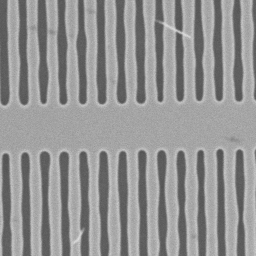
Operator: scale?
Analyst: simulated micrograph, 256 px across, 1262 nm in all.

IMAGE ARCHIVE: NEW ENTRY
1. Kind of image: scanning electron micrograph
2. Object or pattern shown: groups of lines, slits or small figures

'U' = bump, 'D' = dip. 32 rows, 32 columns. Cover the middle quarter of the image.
DUUDDDUUDDDUUDDUUUDDUUUDDUUUDDUU
DUUDDDUUDDDUUDDUUUDDUUUDDUUUDDUU
DUUUDDUUDDDUUDDUUUDDUUUDDUUUDDUU
DUUUDDUUDDDUUDDUUUDDDUUDDUUUDDUU
DUUUDDUUDDDUUDDDUUDDDUUDDUUUDDUU
DUUUDDUUDDDUUDDDUUDDUUUDDUUUDDUU
DUUUDDUUDDDUUDDDUUDDDUUDDUUUDDUU
DUUUDDUUDDDUUDDDUUDDDUUDDUUUDDUU
DUUUDDUUDDDUUDDDUUDDDUUDDUUUDDUU
DUUUDDUUUDDUUUDUUUDDUUUUUUUUUUUU
UUUUUUUUUUUUUUUUUUUUUUUUUUUUUUUU
UUUUUUUUUUUUUUUUUUUUUUUUUUUUUUUU
UUUUUUUUUUUUUUUUUUUUUUUUUUUUUUUU
UUUUUUUUUUUUUUUUUUUUUUUUUUUUUUUU
UUUUUUUUUUUUUUUUUUUUUUUUUUUUUUUU
UUUUUUUUUUUUUUUUUUUUUUUUUUUUUUUU
UUUUUUUUUUUUUUUUUUUUUUUUUUUUUUUU
UUUUUUUUUUUUUUUUUUUUUUUUUUUUUUUU
UUUUUUUUUUUUUUUUUUUUUUUUUUUUUUUU
UUUUUUUUUUUUUUUUUUUUUUUUUUUUUUUU
UUUUUUUUUUUUUUUUUUUUUUUUUUUUUUUU
UUUUUUUUUUUUUUUUUUUDUUUUUUUUUUUU
DUUUDDUUUDDUUUDDUUDDDUUDDUUUDDUU
DUUUDDUUUDDUUUDDUUDDDUUDDDUUDDUU
DUUUDDUUUDDUUUDDUUDDDUUDDDUUDDUU
DUUUDDUUUDDUUDDDUUDDDUUDDDUUDDDU
DUUUDDUUUDDUUDDDUUDDDUUDDDUUDDDU
DUUUDDUUUDDUUDDDUUDDDUUDDDUUDDUU
DUUUDDUUUDDUUDDDUUDDDUUUDUUUDDUU
DUUUDDUUUDDUUDDDUUDDDUUUDUUUDDUU
DUUUDDUUUDDUUDDDUUDDDUUUDUUUDDUU
DUUUDDUUUDDUUDDDUUDDDUUUDUUUDDUU